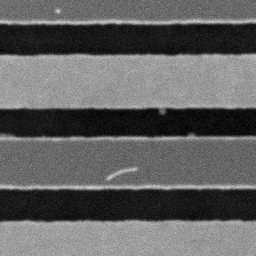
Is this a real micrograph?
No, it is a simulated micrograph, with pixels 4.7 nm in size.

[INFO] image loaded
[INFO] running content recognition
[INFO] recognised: lines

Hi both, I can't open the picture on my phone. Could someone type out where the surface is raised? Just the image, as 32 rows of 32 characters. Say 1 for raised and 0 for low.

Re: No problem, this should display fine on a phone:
11111111111111111111111111111111
11111111111111111111111111111111
11111111111111111111111111111111
00000000000000000000000000000000
00000000000000000000000000000000
00000000000000000000000000000000
00000000000000000000000000000000
11111111111111111111111111111111
11111111111111111111111111111111
11111111111111111111111111111111
11111111111111111111111111111111
11111111111111111111111111111111
11111111111111111111111111111111
11111111111111111110011000001110
00000000000000000000000000000000
00000000000000000000000000000000
00000000000000000000000000000000
11111111111111111111111111111111
11111111111111111111111111111111
11111111111111111111111111111111
11111111111111111111111111111111
11111111111111111111111111111111
11111111111111111111111111111111
11111111111111111111111111111111
00000000000000000000000000000000
00000000000000000000000000000000
00000000000000000000000000000000
00000000000000000000000000000000
11111111111111111111111111111111
11111111111111111111111111111111
11111111111111111111111111111111
11111111111111111111111111111111